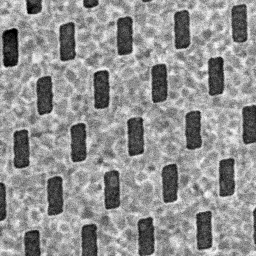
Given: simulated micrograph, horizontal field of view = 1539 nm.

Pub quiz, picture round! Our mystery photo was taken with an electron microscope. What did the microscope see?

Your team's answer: a regular array of holes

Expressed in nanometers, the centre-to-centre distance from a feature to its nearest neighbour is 344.